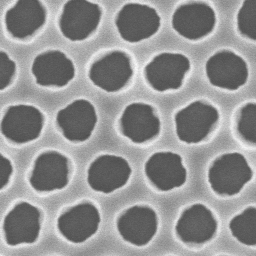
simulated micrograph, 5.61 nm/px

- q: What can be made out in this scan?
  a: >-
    a regular array of holes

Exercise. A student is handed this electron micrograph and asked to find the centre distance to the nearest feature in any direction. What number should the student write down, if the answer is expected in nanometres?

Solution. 318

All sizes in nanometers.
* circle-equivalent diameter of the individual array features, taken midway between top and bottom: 230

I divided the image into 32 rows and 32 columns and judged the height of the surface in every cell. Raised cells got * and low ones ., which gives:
**...***....****.******...****..
*.....**.....**.....**.....***..
*.....*.....**......*......***..
*....**.....***.....**.....***..
**..****...****....****...****..
********************************
.****...*****...***********..***
.***.....***....***.....**....**
..**.....**.....**......**.....*
..**.....**.....**.....***.....*
.****...****....***....****...**
********************************
**********.*********************
*....***....****...****....***..
.....**.....***.....**.....***..
.....**.....***.....**.....***..
.....***....***.....**....****..
*...*****..*****...****..*****..
********************************
*****...****...****...*****...**
.***.....**.....**.....***.....*
.***.....**.....**.....***......
.***.....**.....***....***.....*
****....***....****...****....**
********************************
**..******..********************
*....***....***....****...****..
*....**......**.....**.....**...
.....**.....***.....**.....**...
*....***...****....***.....**...
*.***************.*****...*****.
********************************